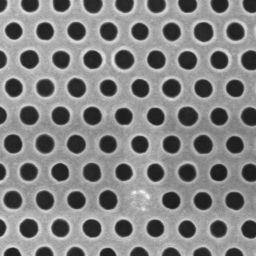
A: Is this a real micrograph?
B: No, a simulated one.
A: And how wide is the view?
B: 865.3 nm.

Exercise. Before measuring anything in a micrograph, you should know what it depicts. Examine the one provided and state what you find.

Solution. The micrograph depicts a regular array of holes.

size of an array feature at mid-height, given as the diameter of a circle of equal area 57.4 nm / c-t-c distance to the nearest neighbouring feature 106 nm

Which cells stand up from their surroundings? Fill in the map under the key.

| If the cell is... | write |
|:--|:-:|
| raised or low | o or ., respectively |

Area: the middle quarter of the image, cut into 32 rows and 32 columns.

.ooooo...oooo....oooo....oooo...
oooooooooooooooooooooooooooooooo
oooooooooooooooooooooooooooooooo
oooooooooooooooooooooooooooooooo
o....ooooo..oooooo..ooooo...oooo
o....oooo....oooo....oooo....ooo
o....oooo....oooo....oooo....ooo
oo...ooooo..oooooo...oooo....ooo
oooooooooooooooooooooooooooooooo
oooooooooooooooooooooooooooooooo
oooooooooooooooooooooooooooooooo
.oooo....ooooo..ooooo...ooooo...
.oooo....oooo....oooo....oooo...
.oooo....oooo....oooo....oooo...
.ooooo...ooooo...oooo....oooo...
oooooooooooooooooooooooooooooooo
oooooooooooooooooooooooooooooooo
oooooooooooooooooooooooooooooooo
o....ooooo..ooooo...oooooo..oooo
o....oooo....oooo....oooo....ooo
o....oooo....oooo....oooo....ooo
oo...ooooo...oooo...ooooo....ooo
oooooooooooooooooooooooooooooooo
oooooooooooooooooooooooooooooooo
oooooooooooooooooooooooooooooooo
oooooo...oooo...ooooo...oooooo..
.oooo....oooo....oooo....oooo...
.oooo....oooo....oooo....oooo...
.oooo....ooooo..ooooo...ooooo...
oooooooooooooooooooooooooooooooo
oooooooooooooooooooooooooooooooo
oooooooooooooooooooooooooooooooo